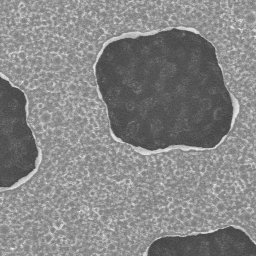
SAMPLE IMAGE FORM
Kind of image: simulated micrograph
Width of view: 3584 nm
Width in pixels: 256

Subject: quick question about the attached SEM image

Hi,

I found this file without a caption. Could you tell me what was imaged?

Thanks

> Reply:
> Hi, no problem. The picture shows holes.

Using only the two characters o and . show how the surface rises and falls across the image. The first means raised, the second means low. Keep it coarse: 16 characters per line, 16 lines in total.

oooooooooooooooo
oooooooooooooooo
ooooooo......ooo
oooooo........oo
oooooo........oo
.ooooo........oo
..ooooo........o
..ooooo.......oo
..ooooo.......oo
..oooooooooooooo
..oooooooooooooo
.ooooooooooooooo
oooooooooooooooo
oooooooooooooooo
ooooooooooooo..o
ooooooooo.......